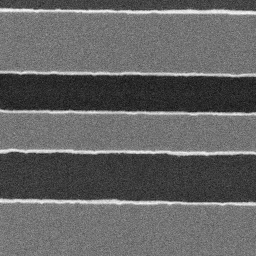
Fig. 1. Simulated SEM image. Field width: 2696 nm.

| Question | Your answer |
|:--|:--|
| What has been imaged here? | lines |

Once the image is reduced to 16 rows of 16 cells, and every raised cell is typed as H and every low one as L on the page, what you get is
LLLLLLLLLLLLLLLL
HHHHHHHHHHHHHHHH
HHHHHHHHHHHHHHHH
HHHHHHHHHHHHHHHH
LHHHHHHHHHHHHHHH
LLLLLLLLLLLLLLLL
LLLLLLLLLLLLLLLL
HHHHHHHHHHHHHHHH
HHHHHHHHHHHHHHHH
LLLLLHHLHHHHHHHH
LLLLLLLLLLLLLLLL
LLLLLLLLLLLLLLLL
LLLLLLLLLLLLLLLL
HHHHHHHHHHHHHHHH
HHHHHHHHHHHHHHHH
HHHHHHHHHHHHHHHH